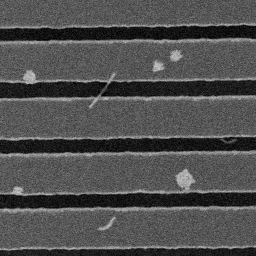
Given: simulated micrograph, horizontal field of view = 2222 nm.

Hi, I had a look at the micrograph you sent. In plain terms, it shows lines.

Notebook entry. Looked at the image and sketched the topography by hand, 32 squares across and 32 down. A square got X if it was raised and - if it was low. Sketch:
XXXXXXXXXXXXXXXXXXXXXXXXXXXXXXXX
XXXXXXXXXXXXXXXXXXXXXXXXXXXXXXXX
XXXXXXXXXXXXXXXXXXXXXXXXXXXXXXXX
--------------------------------
--------------------------------
XXXXXXXXXXXXXXXXXXXXXXXXXXXXXXXX
XXXXXXXXXXXXXXXXXXXXXXXXXXXXXXXX
XXXXXXXXXXXXXXXXXXXXXXXXXXXXXXXX
XXXXXXXXXXXXXXXXXXXXXXXXXXXXXXXX
XXXXXXXXXXXXXXXXXXXXXXXXXXXXXXXX
--------------------------------
--------------------------------
XXXXXXXXXXXXXXXXXXXXXXXXXXXXXXXX
XXXXXXXXXXXXXXXXXXXXXXXXXXXXXXXX
XXXXXXXXXXXXXXXXXXXXXXXXXXXXXXXX
XXXXXXXXXXXXXXXXXXXXXXXXXXXXXXXX
XXXXXXXXXXXXXXXXXXXXXXXXXXXXXXXX
-XX-----------------------------
--------------------------------
XXXXXXXXXXXXXXXXXXXXXXXXXXXXXXXX
XXXXXXXXXXXXXXXXXXXXXXXXXXXXXXXX
XXXXXXXXXXXXXXXXXXXXXXXXXXXXXXXX
XXXXXXXXXXXXXXXXXXXXXXXXXXXXXXXX
XXXXXXXXXXXXXXXXXXXXXXXXXXXXXXXX
--------------------------------
--------------------------------
XXXXXXXXXXXXXXXXXXXXXXXXXXXXXXXX
XXXXXXXXXXXXXXXXXXXXXXXXXXXXXXXX
XXXXXXXXXXXXXXXXXXXXXXXXXXXXXXXX
XXXXXXXXXXXXXXXXXXXXXXXXXXXXXXXX
XXXXXXXXXXXXXXXXXXXXXXXXXXXXXXXX
--------------------------------